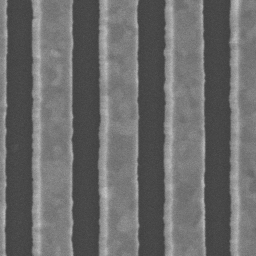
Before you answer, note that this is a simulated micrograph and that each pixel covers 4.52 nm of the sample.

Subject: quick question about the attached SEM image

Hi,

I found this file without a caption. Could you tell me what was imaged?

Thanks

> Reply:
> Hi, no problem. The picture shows lines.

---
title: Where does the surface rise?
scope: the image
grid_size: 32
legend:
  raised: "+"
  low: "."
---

+...+++++....++++....++++....+++
+....++++....++++....++++....+++
+...+++++....++++....++++....+++
+...+++++....++++....++++....+++
+...+++++....++++....++++....+++
+...+++++....++++....++++....+++
+...+++++....++++....++++....+++
+....++++....++++....++++....+++
+...+++++....++++....++++....+++
+...+++++....++++....+++++...+++
+....++++....++++....+++++...+++
+...+++++....++++....++++....+++
+....++++....++++....+++++...+++
+...+++++....++++....++++....+++
+...+++++....++++....+++++...+++
+....++++....++++....+++++...+++
+...+++++....++++....+++++...+++
+...+++++....++++....+++++...+++
+...+++++....++++....+++++...+++
+...+++++....++++....+++++...+++
+...+++++....++++....+++++...+++
+...+++++....++++....+++++...+++
+....++++....++++....++++....+++
+....++++....++++....+++++...+++
+....++++....++++....++++....+++
+....++++....++++....+++++...+++
+...+++++....++++....+++++...+++
+...+++++....++++....+++++...+++
+...+++++....++++....+++++...+++
+...+++++....++++....+++++...+++
+....++++....++++....+++++...+++
+...+++++....++++....+++++...+++